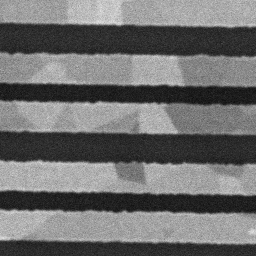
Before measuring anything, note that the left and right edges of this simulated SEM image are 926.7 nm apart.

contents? lines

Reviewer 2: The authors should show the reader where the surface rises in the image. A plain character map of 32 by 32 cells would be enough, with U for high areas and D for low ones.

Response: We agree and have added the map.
UUUUUUUUUUUUUUUUUUUUUUUUUUUUUUUU
UUUUUUUUUUUUUUUUUUUUUUUUUUUUUUUU
UUUUUUUUUUUUUUUUUUUUUUUUUUUUUUUU
DDDDDDDDDDDDDDDDDDDDDDDDDDDDDDDD
DDDDDDDDDDDDDDDDDDDDDDDDDDDDDDDD
DDDDDDDDDDDDDDDDDDDDDDDDDDDDDDDD
DDDDDDDDDDDDDDDDDDDDDDDDDDDDDDDD
UUUUUUUUUUUUUUUUUUUUUUUUUUUUUUUU
UUUUUUUUUUUUUUUUUUUUUUUUUUUUUUUU
UUUUUUUUUUUUUUUUUUUUUUUUUUUUUUUU
DDDDDDDDDUUUUUUUUUUUUUUUUUUUUUUU
DDDDDDDDDDDDDDDDDDDDDDDDDDDDDDDD
DDDDDDDDDDDDDDDDDDDDDDDDDDDDDDDD
UUUUUUUUUUUUUUUUUUUUUUUUUUUUUUUU
UUUUUUUUUUUUUUUUUUUUUUUUUUUUUUUU
UUUUUUUUUUUUUUUUUUUUUUUUUUUUUUUU
DDDDDDDDDUUUUUUUUUUUUUUUUUUUUUUU
DDDDDDDDDDDDDDDDDDDDDDDDDDDDDDDD
DDDDDDDDDDDDDDDDDDDDDDDDDDDDDDDD
DDDDDDDDDDDDDDDDDDDDDDDDDDDDDDDD
UUUUUUUUUUUUUUUUUUUUDDDUUDDDDDDD
UUUUUUUUUUUUUUUUUUUUUUUUUUUUUUUU
UUUUUUUUUUUUUUUUUUUUUUUUUUUUUUUU
UUUUUUUUUUUUUUUUUUUUUUUUUUUUUUUU
DDDDDDDDDDDDDDDDDDDDDDDDDDDDDDDD
DDDDDDDDDDDDDDDDDDDDDDDDDDDDDDDD
UUUUUUUUDDDUDDDDDDDDDDDDDDDDDDDD
UUUUUUUUUUUUUUUUUUUUUUUUUUUUUUUU
UUUUUUUUUUUUUUUUUUUUUUUUUUUUUUUU
UUUUUUUUUUUUUUUUUUUUUUUUUUUUUUUU
DDDDDDDDDDDDDDDDDDDDDDDDDDDDDDDD
DDDDDDDDDDDDDDDDDDDDDDDDDDDDDDDD